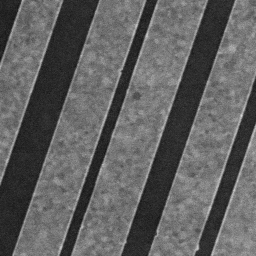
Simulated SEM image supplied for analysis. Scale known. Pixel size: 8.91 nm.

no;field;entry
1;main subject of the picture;one or a few lines or trenches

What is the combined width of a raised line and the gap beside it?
576 nm